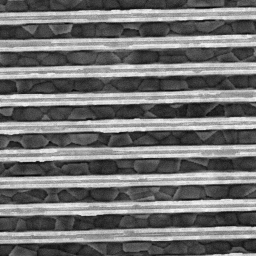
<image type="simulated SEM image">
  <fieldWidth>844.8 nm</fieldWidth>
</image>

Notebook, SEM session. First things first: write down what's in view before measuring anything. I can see parallel lines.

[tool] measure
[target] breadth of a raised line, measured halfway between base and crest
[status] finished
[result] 0.0338 microns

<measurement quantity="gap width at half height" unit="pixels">17.1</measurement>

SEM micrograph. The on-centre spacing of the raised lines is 27.4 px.